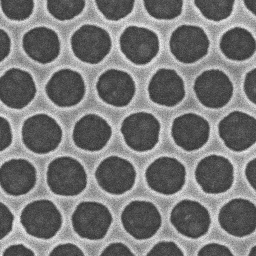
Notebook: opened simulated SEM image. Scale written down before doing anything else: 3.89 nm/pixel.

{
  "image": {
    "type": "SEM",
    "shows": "a regular array of holes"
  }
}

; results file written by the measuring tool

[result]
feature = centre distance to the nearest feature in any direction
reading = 191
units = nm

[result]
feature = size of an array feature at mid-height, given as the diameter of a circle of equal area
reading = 153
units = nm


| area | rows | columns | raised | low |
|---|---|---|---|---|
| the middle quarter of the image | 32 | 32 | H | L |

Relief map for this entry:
HHHHHHHHHHHHHHHHHHHHHHHHHHHHHHHH
LLHHHHHHHHHLLLHHHHHHHHHLLLLHHHHH
LLLLHHHHHLLLLLLLHHHHHHHLLLLLHHHH
LLLLLHHHHLLLLLLLLHHHHHLLLLLLLHHH
LLLLLHHHLLLLLLLLLLHHHLLLLLLLLLHH
LLLLLHHHLLLLLLLLLLHHHLLLLLLLLLHH
LLLLLHHHLLLLLLLLLLHHHLLLLLLLLLHH
LLLLLHHHHLLLLLLLLLHHHLLLLLLLLLHH
LLLLLHHHHLLLLLLLLHHHHHLLLLLLLLHH
LLLLHHHHHHLLLLLLLHHHHHLLLLLLLHHH
LLHHHHHHHHHHHLLLHHHHHHHHHHLHHHHH
HHHHHHHHHHHHHHHHHHHHHHHHHHHHHHHH
HHHHHHLLHHHHHHHHHLLLLLHHHHHHHHLL
HHHHLLLLLLHHHHHLLLLLLLLHHHHHLLLL
HHHLLLLLLLLHHHHLLLLLLLLLHHHLLLLL
HHHLLLLLLLLHHHLLLLLLLLLLHHHLLLLL
HHLLLLLLLLLLHHLLLLLLLLLLHHHLLLLL
HHLLLLLLLLLLHHLLLLLLLLLLHHHLLLLL
HHLLLLLLLLLLHHHLLLLLLLLLHHHLLLLL
HHLLLLLLLLLHHHHLLLLLLLLHHHHHLLLL
HHHLLLLLLLHHHHHHLLLLLLLHHHHHHLLL
HHHHHLLLLHHHHHHHHHLLLHHHHHHHHHLL
HHHHHHHHHHHHHHHHHHHHHHHHHHHHHHHH
LLHHHHHHHHHLLLHHHHHHHHHLLLLLHHHH
LLLLHHHHHLLLLLLLHHHHHHLLLLLLLHHH
LLLLLHHHHLLLLLLLLHHHHLLLLLLLLLHH
LLLLLHHHLLLLLLLLLLHHHLLLLLLLLLLH
LLLLLLHHLLLLLLLLLLHHLLLLLLLLLLLH
LLLLLLHHLLLLLLLLLLHHLLLLLLLLLLHH
LLLLLLHHLLLLLLLLLLHHHLLLLLLLLLHH
LLLLLLHHHLLLLLLLLHHHHLLLLLLLLLHH
LLLLLHHHHHLLLLLLLHHHHHLLLLLLLHHH